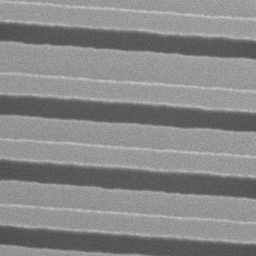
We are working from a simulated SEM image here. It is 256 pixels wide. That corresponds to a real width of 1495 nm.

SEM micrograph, lines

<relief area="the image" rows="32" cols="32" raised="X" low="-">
XXXXXXXXXXXXXXXXXXXXXXXXXXXXXXXX
XXXXXXXXXXXXXXXXXXXXXXXXXXXXXXXX
XXXXXXXXXXXXXXXXXXXXXXXXXXXXXXXX
------------XXXXXXXXXXXXXXXXXXXX
-------------------------XXXXXXX
XXX-----------------------------
XXXXXXXXXXXXXXXXXXX-------------
XXXXXXXXXXXXXXXXXXXXXXXXXXXXXXXX
XXXXXXXXXXXXXXXXXXXXXXXXXXXXXXXX
XXXXXXXXXXXXXXXXXXXXXXXXXXXXXXXX
XXXXXXXXXXXXXXXXXXXXXXXXXXXXXXXX
XXXXXXXXXXXXXXXXXXXXXXXXXXXXXXXX
------------XXXXXXXXXXXXXXXXXXXX
-------------------------XXXXXXX
--------------------------------
XXXXXXXXXXXXXXXXX---------------
XXXXXXXXXXXXXXXXXXXXXXXXXXXXXX--
XXXXXXXXXXXXXXXXXXXXXXXXXXXXXXXX
XXXXXXXXXXXXXXXXXXXXXXXXXXXXXXXX
XXXXXXXXXXXXXXXXXXXXXXXXXXXXXXXX
----------XXXXXXXXXXXXXXXXXXXXXX
------------------------XXXXXXXX
--------------------------------
XXXXXXXXXXXX--------------------
XXXXXXXXXXXXXXXXXXXXXXXXX-------
XXXXXXXXXXXXXXXXXXXXXXXXXXXXXXXX
XXXXXXXXXXXXXXXXXXXXXXXXXXXXXXXX
XXXXXXXXXXXXXXXXXXXXXXXXXXXXXXXX
------XXXXXXXXXXXXXXXXXXXXXXXXXX
-------------------XXXXXXXXXXXXX
--------------------------------
XXXXXXXXXX----------------------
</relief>